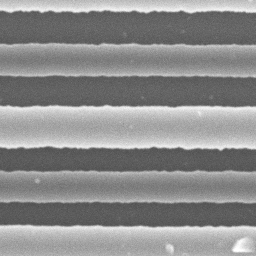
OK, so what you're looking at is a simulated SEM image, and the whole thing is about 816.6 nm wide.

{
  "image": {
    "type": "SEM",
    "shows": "lines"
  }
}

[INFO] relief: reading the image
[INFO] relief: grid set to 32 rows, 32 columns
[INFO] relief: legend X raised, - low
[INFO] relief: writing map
XXXXXXXXXXXXXXXXXXXXXXXXXXXXXXXX
-X---X---X-------XX----XX-----XX
--------------------------------
--------------------------------
--------------------------------
---XX-XX-----X--X---------------
XXXXXXXXXXXXXXXXXXXXXXXXXXXXXXXX
XXXXXXXXXXXXXXXXXXXXXXXXXXXXXXXX
XXXXXXXXXXXXXXXXXXXXXXXXXXXXXXXX
----------------------------XXXX
--------------------------------
--------------------------------
--------------------------------
XXXXXXXXXXXXXXXXXXXXXXXXXXXXXXXX
XXXXXXXXXXXXXXXXXXXXXXXXXXXXXXXX
XXXXXXXXXXXXXXXXXXXXXXXXXXXXXXXX
XXXXXXXXXXXXXXXXXXXXXXXXXXXXXXXX
XXXXXXXXXXXXXXXXXXXXXXXXXXXXXXXX
-X-X----------XXXX---X-XXXXXXX-X
--------------------------------
--------------------------------
X-XXX--XXXXX------XXX-X-XX--XX--
XXXXXXXXXXXXXXXXXXXXXXXXXXXXXXXX
XXXXXXXXXXXXXXXXXXXXXXXXXXXXXXXX
XXXXXXXXXXXXXXXXXXXXXXXXXXXXXXXX
--------------------------------
--------------------------------
--------------------------------
XXXXXXXXXXXXXXXXXXXXXXXXXXXXXXXX
XXXXXXXXXXXXXXXXXXXXXXXXXXXXXXXX
XXXXXXXXXXXXXXXXXXXXXXXXXXXXXXXX
XXXXXXXXXXXXXXXXXXXXXXXXXXXXXXXX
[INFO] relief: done